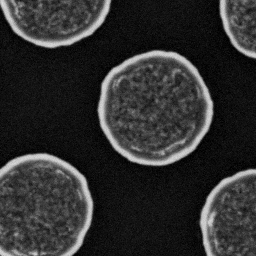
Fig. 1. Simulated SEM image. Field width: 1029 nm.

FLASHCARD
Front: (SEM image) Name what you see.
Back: raised bodies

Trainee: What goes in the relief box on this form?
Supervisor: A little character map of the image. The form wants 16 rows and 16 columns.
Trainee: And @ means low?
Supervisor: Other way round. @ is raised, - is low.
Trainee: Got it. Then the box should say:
@@@@@@@-------@@
-@@@@@--------@@
--@@@----------@
---------@@-----
-------@@@@@----
-------@@@@@@---
------@@@@@@@---
------@@@@@@@---
-------@@@@@@---
--------@@@@----
@@@@------------
@@@@@---------@@
@@@@@@-------@@@
@@@@@@-------@@@
@@@@@--------@@@
@@@@@--------@@@